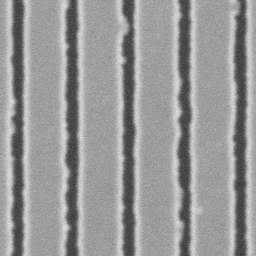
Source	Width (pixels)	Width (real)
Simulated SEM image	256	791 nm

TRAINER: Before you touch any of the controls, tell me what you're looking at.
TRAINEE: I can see lines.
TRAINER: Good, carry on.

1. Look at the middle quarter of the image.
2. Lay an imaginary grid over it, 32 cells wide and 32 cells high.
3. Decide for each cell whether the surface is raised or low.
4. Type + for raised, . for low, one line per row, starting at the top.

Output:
....++++++++++....+++++++++++...
....++++++++++....++++++++++....
....++++++++++....+++++++++++...
....++++++++++....+++++++++++...
....++++++++++....+++++++++++...
....++++++++++....+++++++++++...
....++++++++++....+++++++++++...
....++++++++++....+++++++++++...
....++++++++++....++++++++++....
....+++++++++++...+++++++++++...
....+++++++++++...++++++++++....
....+++++++++++...+++++++++++...
....++++++++++....+++++++++++...
....++++++++++....+++++++++++...
....++++++++++....++++++++++....
....+++++++++++...+++++++++++...
....+++++++++++...+++++++++++...
....+++++++++++...+++++++++++...
....++++++++++....+++++++++++...
....++++++++++....+++++++++++...
....++++++++++....++++++++++....
....++++++++++....++++++++++....
....++++++++++....++++++++++....
....+++++++++++...++++++++++....
....+++++++++++...+++++++++++...
....+++++++++++...+++++++++++...
....+++++++++++...++++++++++....
+...++++++++++....+++++++++++...
....++++++++++....++++++++++....
....++++++++++....+++++++++++...
....++++++++++....+++++++++++...
....++++++++++....+++++++++++...